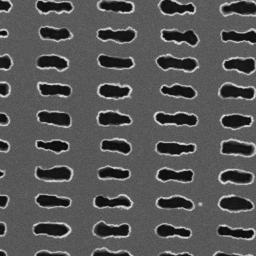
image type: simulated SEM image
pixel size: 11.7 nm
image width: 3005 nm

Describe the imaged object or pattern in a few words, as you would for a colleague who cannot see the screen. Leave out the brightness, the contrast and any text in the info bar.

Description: a regular array of holes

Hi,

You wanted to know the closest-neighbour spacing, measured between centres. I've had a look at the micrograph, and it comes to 323 nm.